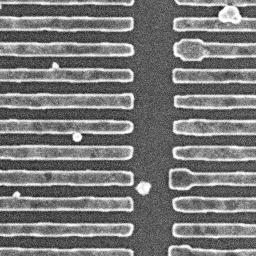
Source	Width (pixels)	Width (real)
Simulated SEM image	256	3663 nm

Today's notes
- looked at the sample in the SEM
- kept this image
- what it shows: wiring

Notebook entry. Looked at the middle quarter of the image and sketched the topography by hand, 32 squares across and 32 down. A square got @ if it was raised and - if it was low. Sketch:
--------------------------------
@@@@@@@@@@------------------@@--
@@@@@@@@@@@@@@@@@----------@@@@@
@@@@@@@@@@@@@@@@@----------@@@@@
----------------------------@@@@
--------------------------------
--------------------------------
--------------------------------
@@@@@@@@@@@@@@@@@-----------@@@@
@@@@@@@@@@@@@@@@@-----------@@@@
@@@@@@@@@@@@@@@@@-----------@@@@
--------------------------------
--------------------------------
--------------------------------
@@@@@@@@@@@@@@@@------------@@@@
@@@@@@@@@@@@@@@@@-----------@@@@
@@@@@@@@@@@@@@@@@-----------@@@@
--@@----------------------------
--@@----------------------------
--------------------------------
--------------------------------
@@@@@@@@@@@@@@@@@----------@@@@@
@@@@@@@@@@@@@@@@@----------@@@@@
@@@@@@@@@@@@@@@@-------------@@@
--------------------------------
--------------------------------
----------------------------@@@-
@@@@@@@@@@@@@@@@@----------@@@@@
@@@@@@@@@@@@@@@@@----------@@@@@
@@@@@@@@@@@@@@@@@----------@@@@@
-------------------@@@-----@@@@@
------------------@@@-----------